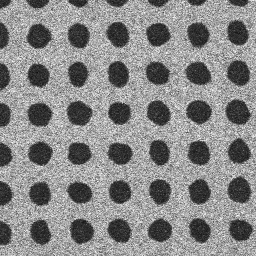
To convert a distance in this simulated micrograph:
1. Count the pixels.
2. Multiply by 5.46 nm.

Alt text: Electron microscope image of a regular array of holes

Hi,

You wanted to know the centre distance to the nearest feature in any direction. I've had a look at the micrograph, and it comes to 212 nm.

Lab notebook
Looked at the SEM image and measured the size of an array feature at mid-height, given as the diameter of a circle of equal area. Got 131 nm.